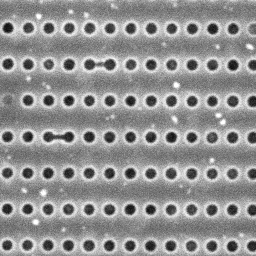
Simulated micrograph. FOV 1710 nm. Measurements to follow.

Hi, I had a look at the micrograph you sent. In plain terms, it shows a regular array of holes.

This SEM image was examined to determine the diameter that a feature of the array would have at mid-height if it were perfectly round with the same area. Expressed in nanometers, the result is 83.5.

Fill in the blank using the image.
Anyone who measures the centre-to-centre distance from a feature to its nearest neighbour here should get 0.136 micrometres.